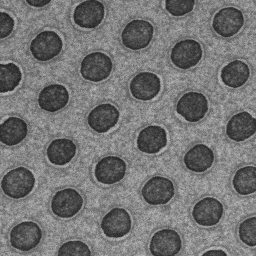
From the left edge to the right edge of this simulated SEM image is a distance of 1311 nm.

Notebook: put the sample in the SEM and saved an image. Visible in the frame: a regular array of holes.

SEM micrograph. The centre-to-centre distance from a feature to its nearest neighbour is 267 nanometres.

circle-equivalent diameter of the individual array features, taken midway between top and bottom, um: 0.158